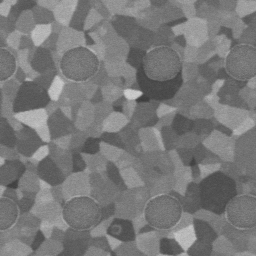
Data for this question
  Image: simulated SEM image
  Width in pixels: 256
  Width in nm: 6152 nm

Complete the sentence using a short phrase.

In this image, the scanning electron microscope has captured holes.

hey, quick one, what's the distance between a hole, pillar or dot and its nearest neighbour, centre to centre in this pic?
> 1970 nm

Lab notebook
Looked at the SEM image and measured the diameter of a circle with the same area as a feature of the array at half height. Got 876 nm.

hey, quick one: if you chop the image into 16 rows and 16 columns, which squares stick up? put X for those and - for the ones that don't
XXXXXXXXXXXXXXXX
XXXXXXXXXXXXXXXX
XXXXXXXXXXXXXXXX
-XXX--XXX--XXX--
-XXX--XXX--XXX--
XXXXXXXXXXXXXXXX
XXXXXXXXXXXXXXXX
XXXXXXXXXXXXXXXX
XXXXXXXXXXXXXXXX
XXXXXXXXXXXXXXXX
XXXXXXXXXXXXXXXX
XXXXXXXXXXXXXXXX
-XXX--XXX--XXXX-
-XXX--XXX--XXX--
XXXXXXXXXXXXXXXX
XXXXXXXXXXXXXXXX